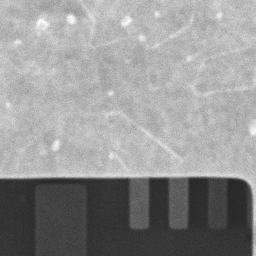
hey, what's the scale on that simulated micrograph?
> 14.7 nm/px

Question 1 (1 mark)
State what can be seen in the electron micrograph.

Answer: wiring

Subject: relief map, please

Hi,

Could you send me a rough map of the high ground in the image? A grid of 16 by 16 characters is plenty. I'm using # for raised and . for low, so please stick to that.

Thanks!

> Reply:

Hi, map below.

################
################
################
################
################
################
################
################
################
################
################
...............#
................
................
................
................